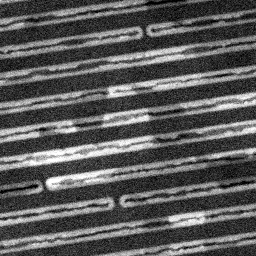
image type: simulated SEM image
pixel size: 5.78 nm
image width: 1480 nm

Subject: parallel lines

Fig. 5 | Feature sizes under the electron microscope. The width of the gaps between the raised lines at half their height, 17.7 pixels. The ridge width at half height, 58.6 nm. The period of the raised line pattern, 159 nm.